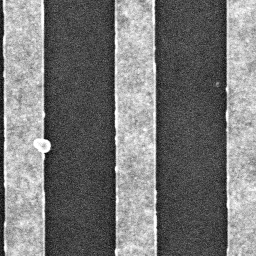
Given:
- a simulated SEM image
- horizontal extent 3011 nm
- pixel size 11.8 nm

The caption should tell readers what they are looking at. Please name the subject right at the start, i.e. lines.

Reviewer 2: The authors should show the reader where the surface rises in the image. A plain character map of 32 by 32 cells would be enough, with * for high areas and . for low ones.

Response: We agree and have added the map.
*****.........*****.........****
*****.........*****.........****
.****.........*****.........****
.****.........*****.........****
*****.........*****.........****
*****.........*****.........****
*****.........*****.........****
.****.........*****.........****
.****.........*****.........****
.****.........*****.........****
.****.........*****.........****
.****.........*****.........****
.****.........*****.........****
.****.........*****.........****
.****.........*****.........****
.****.........*****.........****
.****..........****.........****
.*****........*****.........****
.*****.........****.........****
.****..........****.........****
.****.........*****.........****
.****.........*****.........****
.****..........****.........****
.****..........****.........****
.****..........****.........****
.****..........****.........****
.****..........****..........***
.****..........****..........***
.****..........****..........***
.****..........****..........***
.****..........****..........***
.****.........*****.........****